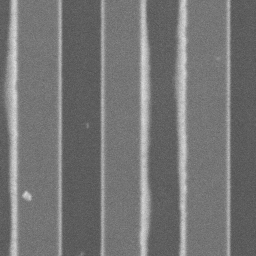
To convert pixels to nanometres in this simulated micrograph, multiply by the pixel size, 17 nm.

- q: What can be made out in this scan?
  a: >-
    lines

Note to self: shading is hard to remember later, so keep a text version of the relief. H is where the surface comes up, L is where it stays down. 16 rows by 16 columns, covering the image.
LHHHLLHHHLLHHHLL
LHHHLLHHHLLHHHLL
LHHHLLHHHLLHHHLL
LHHHLLHHHLLHHHLL
LHHHLLHHHLLHHHLL
LHHHLLHHHLLHHHLL
LHHHLLHHHLLHHHLL
LHHHLLHHHLLHHHLL
LHHHLLHHHLLHHHLL
LHHHLLHHHLLHHHLL
LHHHLLHHHLLHHHLL
LHHHLLHHHLLHHHLL
LHHHLLHHHLLHHHLL
LHHHLLHHHLLHHHLL
LHHHLLHHHLLHHHLL
LHHHLLHHHLLHHHLL